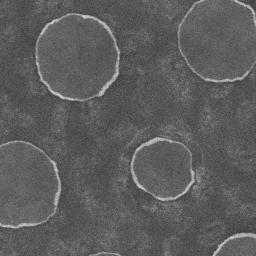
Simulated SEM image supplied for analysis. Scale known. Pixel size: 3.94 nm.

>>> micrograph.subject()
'raised bodies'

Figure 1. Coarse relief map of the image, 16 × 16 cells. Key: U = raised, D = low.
DDDDDDDDDDDDUUUU
DDDUUUUDDDDUUUUU
DDUUUUUDDDDUUUUU
DDUUUUUDDDDUUUUU
DDUUUUUDDDDDUUUU
DDDUUUUDDDDDDDDD
DDDDDDDDDDDDDDDD
DDDDDDDDDDDDDDDD
DDDDDDDDDDDDDDDD
UUUDDDDDUUUUDDDD
UUUUDDDDUUUUDDDD
UUUUDDDDDUUUDDDD
UUUUDDDDDDUDDDDD
UUUDDDDDDDDDDDDD
DDDDDDDDDDDDDDDD
DDDDDDDDDDDDDDUU